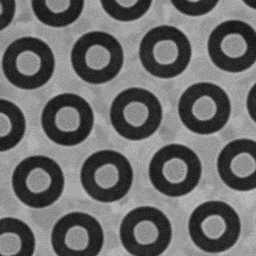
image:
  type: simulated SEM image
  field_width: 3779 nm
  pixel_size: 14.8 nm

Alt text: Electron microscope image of an array of small figures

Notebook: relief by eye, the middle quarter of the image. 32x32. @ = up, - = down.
@@----@@@@-----@@@@------------@
@@------------@@@@@@-----------@
@@@-----------@@@@@@@--------@@@
@@@@---------@@@@@@@@@@-----@@@@
@@@@@------@@@@@@@@@@@@@@@@@@@@@
@@@@@@@@@@@@@@@@@@@@@@@@@@@@@@@-
@@@@@@@@@@@@@@@------@@@@@@@@@--
----@@@@@@@@@----------@@@@@@---
-----@@@@@@@------------@@@@@---
------@@@@@@------------@@@@----
-------@@@@-----@@@@-----@@@----
@@@----@@@@----@@@@@@----@@@----
@@@-----@@@----@@@@@@----@@@----
@@@@----@@@----@@@@@-----@@@@---
@@@@----@@@-----@@@@----@@@@@---
@@@@---@@@@@------------@@@@@@--
@@-----@@@@@@-----------@@@@@@@-
-------@@@@@@----------@@@@@@@@@
------@@@@@@@@@------@@@@@@@@@@@
-----@@@@@@@@@@@@@@@@@@@@@@@@@@@
---@@@@@@@@@@@@@@@@@@@@@@------@
@@@@@@@@@----@@@@@@@@@@---------
@@@@@@@--------@@@@@@@----------
@@@@@-----------@@@@@@----------
@@@@@------------@@@@-----@@@@--
@@@@------@@-----@@@@----@@@@@@-
@@@@----@@@@@----@@@@----@@@@@@-
@@@@----@@@@@-----@@@----@@@@@--
@@@@----@@@@@-----@@@-----@@@@--
@@@@----@@@@@----@@@@@-----@@---
@@@@-----@@@-----@@@@@----------
@@@@@------------@@@@@@---------